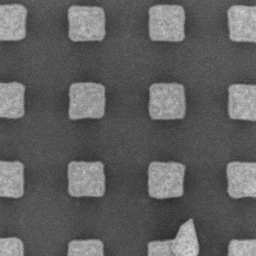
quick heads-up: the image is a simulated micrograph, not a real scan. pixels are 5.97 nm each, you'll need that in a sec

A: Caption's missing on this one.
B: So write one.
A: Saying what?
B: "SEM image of raised bodies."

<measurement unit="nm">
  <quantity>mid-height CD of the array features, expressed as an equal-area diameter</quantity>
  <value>228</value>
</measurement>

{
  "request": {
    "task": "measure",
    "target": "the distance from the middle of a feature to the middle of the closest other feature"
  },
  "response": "469 nm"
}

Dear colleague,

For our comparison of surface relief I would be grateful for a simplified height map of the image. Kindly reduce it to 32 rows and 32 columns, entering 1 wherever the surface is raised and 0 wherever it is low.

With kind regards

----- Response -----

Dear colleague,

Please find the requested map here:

00000000000000000000000000000000
11100000011110000001111000000111
11100000011110000001111000000111
11100000011110000001111000000111
11100000011110000001111000000111
00000000000000000000000000000000
00000000000000000000000000000000
00000000000000000000000000000000
00000000000000000000000000000000
00000000000000000000000000000000
11000000001100000000000000000000
11100000011110000001111000000111
11100000011110000001111000000111
11100000011110000001111000000111
11100000011110000001111000000111
00000000000000000000000000000000
00000000000000000000000000000000
00000000000000000000000000000000
00000000000000000000000000000000
00000000000000000000000000000000
11100000011110000001110000000111
11100000011110000001111000001111
11100000011110000001111000000111
11100000011110000001111000000111
11100000000000000001110000000111
00000000000000000000000000000000
00000000000000000000000000000000
00000000000000000000000000000000
00000000000000000000000100000000
00000000000000000000001110000000
11100000011110000001111110000111
11100000011110000001111110000111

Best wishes